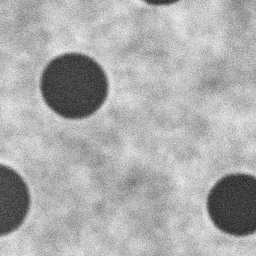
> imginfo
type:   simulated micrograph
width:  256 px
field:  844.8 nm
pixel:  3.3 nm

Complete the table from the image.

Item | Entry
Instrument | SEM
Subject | holes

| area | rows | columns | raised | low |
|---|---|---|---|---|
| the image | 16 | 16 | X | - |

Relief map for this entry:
XXXXXXXXXXXXXXXX
XXXXXXXXXXXXXXXX
XXXXXXXXXXXXXXXX
XXXX-XXXXXXXXXXX
XXX----XXXXXXXXX
XXX----XXXXXXXXX
XXX---XXXXXXXXXX
XXXXXXXXXXXXXXXX
XXXXXXXXXXXXXXXX
XXXXXXXXXXXXXXXX
-XXXXXXXXXXXXXXX
--XXXXXXXXXXX---
--XXXXXXXXXXX---
--XXXXXXXXXXX---
-XXXXXXXXXXXXX--
XXXXXXXXXXXXXXXX